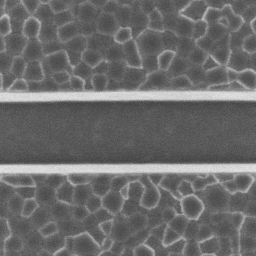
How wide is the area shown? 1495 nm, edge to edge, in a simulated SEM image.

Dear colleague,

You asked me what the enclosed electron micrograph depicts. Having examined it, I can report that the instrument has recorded one or a few lines or trenches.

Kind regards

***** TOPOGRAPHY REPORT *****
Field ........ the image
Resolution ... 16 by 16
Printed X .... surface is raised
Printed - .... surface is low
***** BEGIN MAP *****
XXXXXXXXXXXXXXXX
XXXXXXXXXXXXXXXX
XXXXXXXXXXXXXXXX
XXXXXXXXXXXXXXXX
XXXXXXXXXXXXXXXX
XXXXXXXXXXXXXXXX
----------------
----------------
----------------
----------------
----------------
XXXXXXXXXXXXXXXX
XXXXXXXXXXXXXXXX
XXXXXXXXXXXXXXXX
XXXXXXXXXXXXXXXX
XXXXXXXXXXXXXXXX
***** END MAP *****